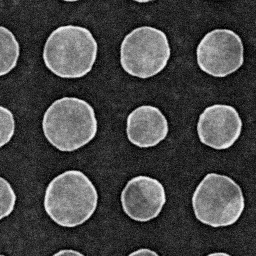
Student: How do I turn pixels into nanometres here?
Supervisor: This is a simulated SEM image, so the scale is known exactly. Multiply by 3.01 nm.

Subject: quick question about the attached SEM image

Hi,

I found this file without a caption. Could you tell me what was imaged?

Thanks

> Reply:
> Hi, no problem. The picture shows a regular array of raised bodies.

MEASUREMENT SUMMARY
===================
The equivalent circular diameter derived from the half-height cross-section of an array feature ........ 0.148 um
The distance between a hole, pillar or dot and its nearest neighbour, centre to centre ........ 217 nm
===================